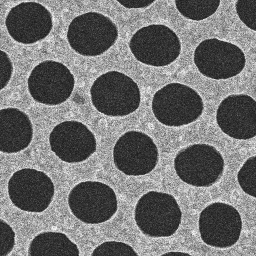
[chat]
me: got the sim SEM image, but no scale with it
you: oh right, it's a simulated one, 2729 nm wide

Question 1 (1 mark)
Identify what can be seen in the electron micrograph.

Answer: a regular array of holes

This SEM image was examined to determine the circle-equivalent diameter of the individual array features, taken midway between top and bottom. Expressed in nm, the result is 487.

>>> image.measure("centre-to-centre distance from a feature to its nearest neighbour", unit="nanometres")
674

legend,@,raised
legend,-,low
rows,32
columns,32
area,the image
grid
@@---@@@@@@@@@@----@@@-----@@@--
@-----@@@@@@@@@@@@@@@@-----@@@--
@-----@@@-----@@@@@@@@@@-@@@@@--
@-----@@@------@@@---@@@@@@@@@@-
@-----@@-------@@-----@@@@@@@@@@
@@@@@@@@@-----@@-------@@----@@@
-@@@@@@@@@---@@@@------@------@@
-@@@@@@@@@@@@@@@@-----@@-------@
--@@----@@@@@@@@@@@@@@@@@-----@@
-@@@-----@@@@---@@@@@@@@@@---@@@
-@@------@@@-----@@@@--@@@@@@@@@
@@@@-----@@------@@@-----@@@@@@@
@@@@----@@@-------@------@@@----
@-@@@@@@@@@@-----@@------@@-----
---@@@@@@@@@@@@@@@@------@@-----
----@@@---@@@@@@@@@@---@@@@-----
----@@-----@@@@@-@@@@@@@@@@@----
----@@------@@@----@@@@@@@@@@@@@
---@@@------@@------@@@----@@@@@
@@@@@@@----@@@------@@------@@@@
@@@@@@@@@@@@@@------@@------@@@-
@@---@@@@@@@@@@----@@@------@@--
@-----@@@@@@@@@@@@@@@@@----@@@--
@------@@-----@@@@@@@@@@@@@@@@--
@------@@------@@@----@@@@@@@@@-
@@----@@@------@@-----@@@@--@@@@
@@@@-@@@@-----@@@------@@-----@@
@@@@@@@@@@---@@@@------@@-----@@
-@@@@@@@@@@@@@@@@-----@@@-----@@
--@@@---@@@@@@@@@@@--@@@@-----@@
--@@-----@@@@---@@@@@@@@@@---@@@
-@@@------@@-----@@@@-@@@@@@@@@@